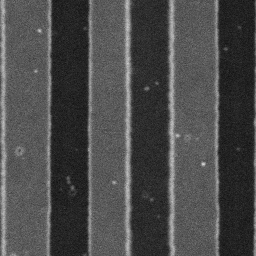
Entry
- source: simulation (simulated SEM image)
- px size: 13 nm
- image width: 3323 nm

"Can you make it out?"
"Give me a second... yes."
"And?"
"lines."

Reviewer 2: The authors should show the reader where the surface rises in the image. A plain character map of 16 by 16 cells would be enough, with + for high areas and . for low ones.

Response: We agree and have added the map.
+++...++...+++..
+++...++...+++..
+++...++...+++..
+++...++...+++..
+++...++...+++..
+++...++...+++..
+++...++...+++..
+++...++...+++..
+++...++...+++..
+++...++...+++..
+++...++...+++..
+++...++...+++..
+++...++...+++..
+++...++...+++..
+++...++...+++..
+++...++...+++..